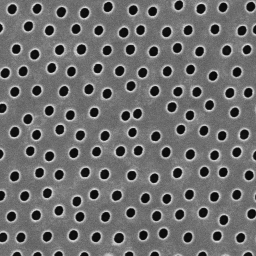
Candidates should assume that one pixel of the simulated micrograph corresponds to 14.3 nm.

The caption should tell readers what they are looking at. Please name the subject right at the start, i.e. a regular array of holes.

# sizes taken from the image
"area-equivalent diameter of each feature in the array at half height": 138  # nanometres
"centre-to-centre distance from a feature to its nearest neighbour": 0.28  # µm